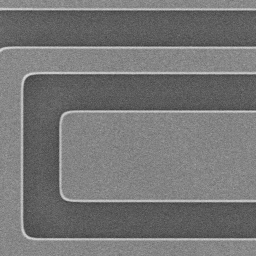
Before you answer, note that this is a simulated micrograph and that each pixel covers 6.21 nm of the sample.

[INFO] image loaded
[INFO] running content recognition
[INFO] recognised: groups of lines, slits or small figures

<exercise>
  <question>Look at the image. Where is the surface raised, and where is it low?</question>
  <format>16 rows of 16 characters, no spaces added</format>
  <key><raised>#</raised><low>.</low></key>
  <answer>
################
................
................
################
################
#...............
#...............
#...############
#...############
#...############
#...############
#...############
#...############
#...............
##..............
################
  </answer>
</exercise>